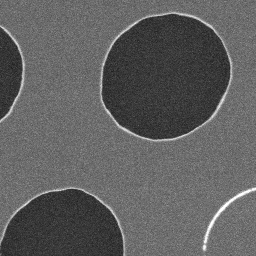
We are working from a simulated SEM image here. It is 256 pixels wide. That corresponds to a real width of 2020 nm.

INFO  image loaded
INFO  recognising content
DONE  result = holes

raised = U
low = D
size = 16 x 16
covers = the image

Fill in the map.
UUUUUUUUUUUUUUUU
UUUUUUUUDDDDDUUU
DUUUUUUDDDDDDDUU
DUUUUUUDDDDDDDUU
DUUUUUDDDDDDDDUU
DUUUUUDDDDDDDDUU
DUUUUUUDDDDDDDUU
UUUUUUUDDDDDDUUU
UUUUUUUUUDDUUUUU
UUUUUUUUUUUUUUUU
UUUUUUUUUUUUUUUU
UUUUUUUUUUUUUUUU
UUDDDDUUUUUUUUUU
UDDDDDDUUUUUUUUU
DDDDDDDDUUUUUUUU
DDDDDDDDUUUUUUUU